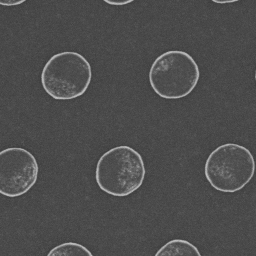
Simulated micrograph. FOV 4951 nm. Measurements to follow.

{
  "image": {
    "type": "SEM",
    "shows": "raised bodies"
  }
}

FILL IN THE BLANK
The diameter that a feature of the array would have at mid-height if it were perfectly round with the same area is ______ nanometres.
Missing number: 915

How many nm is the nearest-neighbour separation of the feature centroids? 2090